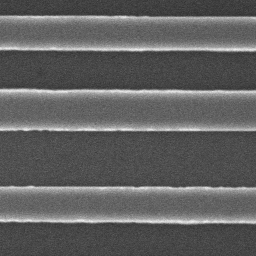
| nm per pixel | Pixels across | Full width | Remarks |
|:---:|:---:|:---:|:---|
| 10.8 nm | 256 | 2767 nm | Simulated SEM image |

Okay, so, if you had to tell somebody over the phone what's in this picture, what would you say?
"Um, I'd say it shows lines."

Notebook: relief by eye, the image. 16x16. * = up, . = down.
................
****************
****************
................
................
................
****************
****************
................
................
................
................
****************
****************
................
................